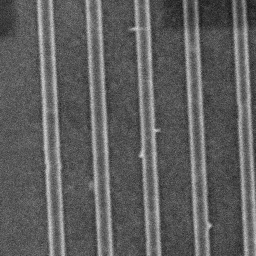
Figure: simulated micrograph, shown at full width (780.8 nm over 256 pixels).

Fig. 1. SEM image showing parallel lines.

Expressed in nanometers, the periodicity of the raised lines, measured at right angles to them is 148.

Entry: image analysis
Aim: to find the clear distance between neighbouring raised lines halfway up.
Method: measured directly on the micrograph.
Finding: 105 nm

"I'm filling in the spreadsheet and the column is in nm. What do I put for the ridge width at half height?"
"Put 43.7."